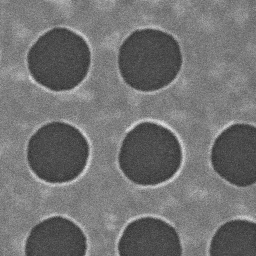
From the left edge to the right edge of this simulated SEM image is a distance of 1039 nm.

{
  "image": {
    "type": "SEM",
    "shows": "holes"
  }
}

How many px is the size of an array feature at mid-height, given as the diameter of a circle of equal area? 64.2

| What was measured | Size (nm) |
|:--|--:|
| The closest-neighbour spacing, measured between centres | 371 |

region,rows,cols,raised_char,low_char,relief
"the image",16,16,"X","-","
XXXXXXXXXXXXXXXX
XXXXXXXXXXXXXXXX
XX---XXX---XXXXX
XX----X----XXXXX
XX---XX----XXXXX
XXX--XXX--XXXXXX
XXXXXXXXXXXXXXXX
XXXXXXXXXXXXXXXX
XX---XXX---XXX--
XX----X----XX---
XX---XX----XX---
XXXXXXXX--XXXX--
XXXXXXXXXXXXXXXX
XXXXXXXXXXXXXXXX
XX---XXX---XX---
XX---XX----XX---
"